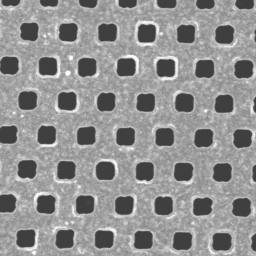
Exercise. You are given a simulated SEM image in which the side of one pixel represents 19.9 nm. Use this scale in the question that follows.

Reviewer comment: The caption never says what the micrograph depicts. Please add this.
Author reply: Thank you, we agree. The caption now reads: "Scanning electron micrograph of a regular array of holes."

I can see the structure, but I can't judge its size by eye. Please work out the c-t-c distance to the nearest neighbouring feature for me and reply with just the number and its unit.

39 pixels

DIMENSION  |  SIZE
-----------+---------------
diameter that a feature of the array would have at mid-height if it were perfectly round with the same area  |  400 nm